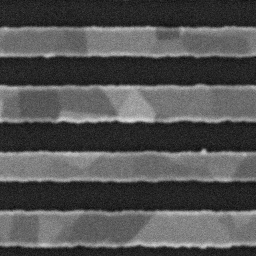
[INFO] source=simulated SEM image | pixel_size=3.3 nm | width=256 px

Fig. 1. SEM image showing lines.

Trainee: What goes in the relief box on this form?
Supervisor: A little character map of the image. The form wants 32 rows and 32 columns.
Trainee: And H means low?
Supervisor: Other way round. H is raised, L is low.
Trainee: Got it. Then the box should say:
LLLLLLLLLLLLLLLLLLLLLLLLLLLLLLLL
LLLLLLLLLLLLLLLLLLLLLLLLLLLLLLLL
LLLLLLLLLLLLLLLLLLLLLLLLLLLLLLLL
LLLHLHHHHHHHHHHLHHHHHLHLLHLLHHHL
HHHHHHHHHHHHHHHHHHHHHHHHHHHHHHHH
HHHHHHHHHHHHHHHHHHHHHHHHHHHHHHHH
HHHHHHHHHHHHHHHHHHHHHHHHHHHHHHHH
LLLLLLLLLLLLLLLLLLLLLLLLLLLLLLLL
LLLLLLLLLLLLLLLLLLLLLLLLLLLLLLLL
LLLLLLLLLLLLLLLLLLLLLLLLLLLLLLLL
LLLLLLLLLLLLLLLLLLLLLLLLLLLLLLLL
HHHHHHHHHHHHHHHHHHHHHHHHHHHHHHHH
HHHHHHHHHHHHHHHHHHHHHHHHHHHHHHHH
HHHHHHHHHHHHHHHHHHHHHHHHHHHHHHHH
HHHHHHHHHHHHHHHHHHHHHHHHHHHHHHHH
LLLLLLLLLLLLLLLLLLLLLLLLLLLLLLLL
LLLLLLLLLLLLLLLLLLLLLLLLLLLLLLLL
LLLLLLLLLLLLLLLLLLLLLLLLLLLLLLLL
LLLLLLLLLLLLLLLLLLLLLLLLLLLLLLLL
HHHHHHHHHHHHHHHHHHHHHHHHHHHHHHHH
HHHHHHHHHHHHHHHHHHHHHHHHHHHHHHHH
HHHHHHHHHHHHHHHHHHHHHHHHHHHHHHHH
HHHHHHHHHHHHHHHHHHHHHHHHHHHHHHHH
LLLLLLLLLLLLLLLLLLLLLLLLLLLLLLLL
LLLLLLLLLLLLLLLLLLLLLLLLLLLLLLLL
LLLLLLLLLLLLLLLLLLLLLLLLLLLLLLLL
HHHHHHHHHHHHHLLHHHHHHHHHHHHLHHLH
HHHHHHHHHHHHHHHHHHHHHHHHHHHHHHHH
HHHHHHHHHHHHHHHHHHHHHHHHHHHHHHHH
HHHHHHHHHHHHHHHHHHHHHHHHHHHHHHHH
HHHHHHHHHHHHHHHHHHHHHHHHHHHHHHHH
LLLLLLLLLLLLLLLLLLLLLLLLLLLLLLLL